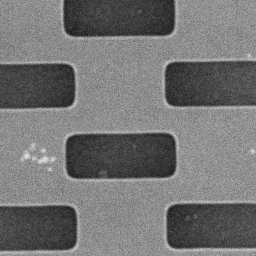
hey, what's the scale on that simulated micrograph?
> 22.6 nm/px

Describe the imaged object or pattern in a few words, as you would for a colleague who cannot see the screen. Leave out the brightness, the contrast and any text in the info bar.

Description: groups of lines, slits or small figures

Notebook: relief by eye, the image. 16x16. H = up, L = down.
HHHHLLLLLLLHHHHH
HHHHLLLLLLLHHHHH
HHHHHHHHHHHHHHHH
HHHHHHHHHHHHHHHH
LLLLLHHHHHLLLLLL
LLLLLHHHHHLLLLLL
LLLLHHHHHHHLLLLL
HHHHHHHHHHHHHHHH
HHHHLLLLLLLHHHHH
HHHHLLLLLLLHHHHH
HHHHLLLLLLLHHHHH
HHHHHHHHHHHHHHHH
HHHHHHHHHHHHHHHH
LLLLLHHHHHLLLLLL
LLLLLHHHHHLLLLLL
LLLLHHHHHHHLLLLL